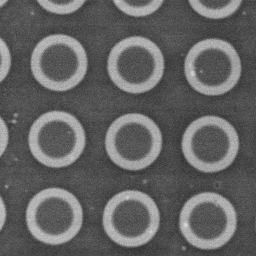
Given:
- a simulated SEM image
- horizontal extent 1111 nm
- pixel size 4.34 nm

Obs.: an array of small figures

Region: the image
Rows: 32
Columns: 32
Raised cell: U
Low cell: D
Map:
DDDDDUUUUUDDDDUUUUUUDDDDUUUUUUDD
DDDDDDUUUDDDDDDUUUUDDDDDDUUUUDDD
DDDDDDDDDDDDDDDDDDDDDDDDDDDDDDDD
DDDDDDDDDDDDDDDDDDDDDDDDDDDDDDDD
DDDDDDUUUDDDDDDDDDDDDDDDDDDDDDDD
UDDDDUUUUUDDDDDUUUUDDDDDDUUUUDDD
UDDDUUUUUUUDDDUUUUUUDDDDUUUUUUDD
UDDDUUUUUUUDDDUUUUUUDDDUUUUUUUDD
UDDDUUUUUUUDDUUUUUUUDDDUUUUUUUDD
UDDDUUUUUUDDDDUUUUUUDDDUUUUUUUDD
DDDDDUUUUUDDDDUUUUUUDDDDUUUUUDDD
DDDDDDDDDDDDDDDDUUDDDDDDDUUUDDDD
DDDDDDDDDDDDDDDDDDDDDDDDDDDDDDDD
DDDDDDDDDDDDDDDDDDDDDDDDDDDDDDDD
DDDDDUUUUDDDDDDUUUDDDDDDDDDDDDDD
UDDDUUUUUUDDDDUUUUUDDDDDUUUUUDDD
UDDDUUUUUUDDDUUUUUUUDDDUUUUUUDDD
UDDDUUUUUUUDDUUUUUUUDDDUUUUUUUDD
UDDDUUUUUUDDDUUUUUUUDDDUUUUUUUDD
DDDDUUUUUUDDDDUUUUUUDDDUUUUUUDDD
DDDDDUUUUDDDDDDUUUUDDDDDUUUUUDDD
DDDDDDDDDDDDDDDDDDDDDDDDDDDDDDDD
DDDDDDDDDDDDDDDDDDDDDDDDDDDDDDDD
DDDDDDDDDDDDDDDDDDDDDDDDDDDDDDDD
DDDDUUUUUDDDDDUUUUDDDDDDUUUUDDDD
DDDDUUUUUUDDDUUUUUUDDDDUUUUUUDDD
UDDUUUUUUUDDDUUUUUUUDDDUUUUUUDDD
UDDUUUUUUUDDDUUUUUUUDDDUUUUUUDDD
DDDDUUUUUUDDDUUUUUUUDDDUUUUUUDDD
DDDDUUUUUDDDDDUUUUUDDDDUUUUUUDDD
DDDDDDUDDDDDDDDUUUDDDDDDUUUUDDDD
DDDDDDDDDDDDDDDDDDDDDDDDDDDDDDDD